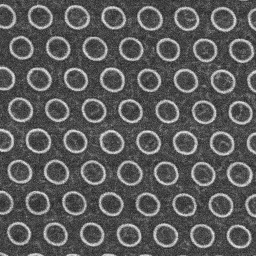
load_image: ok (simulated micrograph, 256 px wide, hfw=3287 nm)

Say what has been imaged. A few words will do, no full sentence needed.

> a regular array of raised bodies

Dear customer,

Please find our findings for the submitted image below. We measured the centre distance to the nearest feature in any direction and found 461 nanometres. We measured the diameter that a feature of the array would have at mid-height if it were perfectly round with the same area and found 22.1 px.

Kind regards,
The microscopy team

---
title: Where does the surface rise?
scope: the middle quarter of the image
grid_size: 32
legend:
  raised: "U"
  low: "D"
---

DDDDDDDDDDDDDDDDDDDDDDDDDDDDDDDD
DUUUDDDDDDDUUDDDDDDDUDDDDDDDDDDD
DUUUUDDDDDUUUUDDDDDUUUUDDDDDUUUU
UUUUUUDDDUUUUUUDDDDUUUUUDDDDUUUU
DUUUUUDDDUUUUUUDDDDUUUUUDDDDUUUU
DUUUUDDDDDUUUUUDDDDUUUUUDDDDUUUU
DDDDDDDDDDDDUUDDDDDDUUUDDDDDDUUU
DDDDDDDDDDDDDDDDDDDDDDDDDDDDDDDD
DDDDDDDDDDDDDDDDDDDDDDDDDDDDDDDD
DDDDDUUUUDDDDDDUUUDDDDDDDUDDDDDD
UDDDDUUUUUDDDDUUUUUDDDDUUUUUDDDD
UDDDDUUUUUDDDDUUUUUDDDDUUUUUDDDD
UDDDDUUUUUDDDDUUUUUDDDDUUUUUDDDD
DDDDDDUUUUDDDDDUUUUDDDDDUUUUDDDD
DDDDDDDDDDDDDDDDDDDDDDDDDDDDDDDD
DDDDDDDDDDDDDDDDDDDDDDDDDDDDDDDD
DDDDDDDDDDDDDDDDDDDDDDDDDDDDDDDD
DUUUDDDDDDUUUDDDDDDUUUUDDDDDUUUU
UUUUUDDDDUUUUUDDDDUUUUUUDDDDUUUU
UUUUUUDDDUUUUUUDDDUUUUUUDDDDUUUU
DUUUUDDDDDUUUUUDDDDUUUUUDDDDUUUU
DDUUUDDDDDUUUUDDDDDUUUUDDDDDUUUU
DDDDDDDDDDDDDDDDDDDDDDDDDDDDDDDD
DDDDDDDDDDDDDDDDDDDDDDDDDDDDDDDD
DDDDDDDDDDDDDDDUUDDDDDDDDDDDDDDD
DDDDDUUUUDDDDDUUUUDDDDDUUUUDDDDD
UDDDDUUUUUDDDDUUUUUDDDDUUUUUDDDD
UDDDDUUUUUDDDDUUUUUDDDDUUUUUDDDD
UDDDDUUUUUDDDDUUUUUDDDDUUUUUDDDD
DDDDDDUUUDDDDDDUUUDDDDDDUUUDDDDD
DDDDDDDDDDDDDDDDDDDDDDDDDDDDDDDD
DDDDDDDDDDDDDDDDDDDDDDDDDDDDDDDD